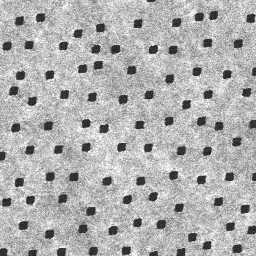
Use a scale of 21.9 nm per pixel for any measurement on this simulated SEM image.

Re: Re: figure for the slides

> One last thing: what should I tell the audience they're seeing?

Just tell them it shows a regular array of holes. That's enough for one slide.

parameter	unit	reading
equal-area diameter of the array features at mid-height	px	9.44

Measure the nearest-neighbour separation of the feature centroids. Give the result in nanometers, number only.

522